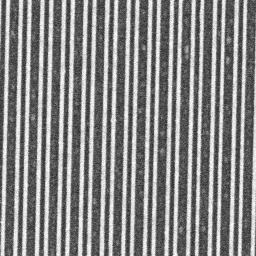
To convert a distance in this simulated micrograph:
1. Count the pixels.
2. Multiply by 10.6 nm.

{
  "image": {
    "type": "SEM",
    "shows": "parallel lines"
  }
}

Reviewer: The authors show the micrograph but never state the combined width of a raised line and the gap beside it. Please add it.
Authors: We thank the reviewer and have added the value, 0.115 um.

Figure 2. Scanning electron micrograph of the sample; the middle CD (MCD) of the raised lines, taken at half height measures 31.8 nanometers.